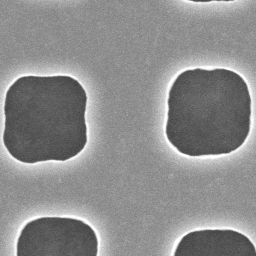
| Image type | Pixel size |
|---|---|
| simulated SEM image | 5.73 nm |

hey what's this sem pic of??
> holes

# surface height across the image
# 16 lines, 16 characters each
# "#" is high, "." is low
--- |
################
################
################
################
###########....#
#....######....#
.....#####......
.....#####......
.....#####.....#
#....######...##
################
################
################
################
#.....######...#
#.....#####.....